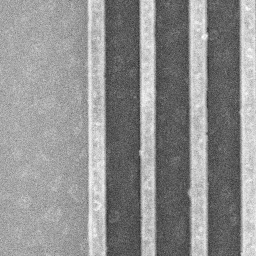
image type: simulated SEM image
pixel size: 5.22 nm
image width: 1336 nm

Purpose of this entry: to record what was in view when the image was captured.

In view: parallel lines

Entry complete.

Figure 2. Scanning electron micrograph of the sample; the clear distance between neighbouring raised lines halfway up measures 36.4 px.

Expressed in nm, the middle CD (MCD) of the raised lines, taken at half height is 75.1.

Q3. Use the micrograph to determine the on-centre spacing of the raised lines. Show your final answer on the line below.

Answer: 264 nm